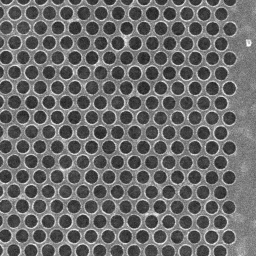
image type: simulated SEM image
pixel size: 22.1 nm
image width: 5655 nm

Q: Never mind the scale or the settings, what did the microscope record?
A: a regular array of holes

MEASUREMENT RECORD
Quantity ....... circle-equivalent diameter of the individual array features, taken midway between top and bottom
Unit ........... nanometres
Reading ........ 304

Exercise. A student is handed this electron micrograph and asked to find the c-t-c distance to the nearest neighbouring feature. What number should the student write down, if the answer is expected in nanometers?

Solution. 376